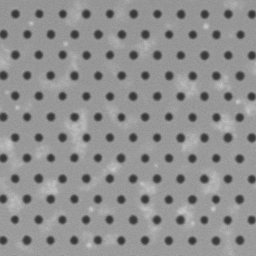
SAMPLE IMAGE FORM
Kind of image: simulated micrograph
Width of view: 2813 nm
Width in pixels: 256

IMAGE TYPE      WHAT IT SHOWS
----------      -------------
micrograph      a regular array of holes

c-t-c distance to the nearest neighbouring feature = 257 nm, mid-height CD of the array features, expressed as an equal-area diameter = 96.9 nanometres